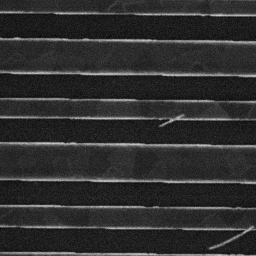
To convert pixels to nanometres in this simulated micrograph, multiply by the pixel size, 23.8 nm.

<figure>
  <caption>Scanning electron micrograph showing lines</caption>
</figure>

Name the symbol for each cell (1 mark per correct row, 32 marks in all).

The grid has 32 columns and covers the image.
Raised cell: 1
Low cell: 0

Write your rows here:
11111111111111111111111111111111
11111111111111111111111111111111
00000000000000000000000000000000
00000000000000000000000000000000
00000000000000000000000000000000
11111111111111111111111111111111
11111111111111111111111111111111
11111111111111111111111111111111
11111111111111111111111111111111
00000000000000000000000000000000
00000000000000000000000000000000
00000000000000000000000000000000
11111111111111111000000000000000
11111111111111111111111111111111
11111111111111111111111111111111
00000000000000000000000000000000
00000000000000000000000000000000
00000000000000000000000000000000
11111111111111111111111111111111
11111111111111111111111111111111
11111111111111111111111111111111
11111111111111111111111111111111
00000111111111111111111111111111
00000000000000000000000000000000
00000000000000000000000000000000
00000000000000000000000000000000
11111111111111111111111111111111
11111111111111111111111111111111
00000000000000111111111111111111
00000000000000000000000000000000
00000000000000000000000000000000
00000000000000000000000000000000